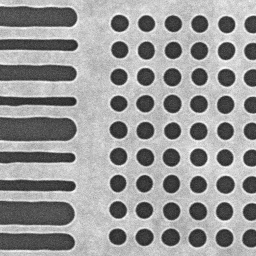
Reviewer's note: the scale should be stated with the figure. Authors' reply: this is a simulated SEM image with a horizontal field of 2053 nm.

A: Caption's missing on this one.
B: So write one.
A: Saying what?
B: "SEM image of groups of lines, slits or small figures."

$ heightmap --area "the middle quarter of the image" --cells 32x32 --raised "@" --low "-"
--@@@@@@@@@@@@@@@@@@@@@@@@@@@@@@
---@@@@@@@@@---@@@@---@@@@---@@@
---@@@@@@@@@----@@-----@@----@@@
---@@@@@@@@-----@@-----@@-----@@
@@@@@@@@@@@@----@@----@@@----@@@
@@@@@@@@@@@@@-@@@@@@-@@@@@--@@@@
@@@@@@@@@@@@@@@@@@@@@@@@@@@@@@@@
@@@@@@@@@@@@@@@@@@@@@@@@@@@@@@@@
---@@@@@@@@@---@@@@---@@@----@@@
---@@@@@@@@-----@@-----@@----@@-
--@@@@@@@@@-----@@-----@@-----@-
@@@@@@@@@@@@---@@@@---@@@----@@@
@@@@@@@@@@@@@@@@@@@@@@@@@@@-@@@@
-@@@@@@@@@@@@@@@@@@@@@@@@@@@@@@@
---@@@@@@@@@@--@@@@@-@@@@@@-@@@@
---@@@@@@@@-----@@----@@@----@@@
---@@@@@@@@-----@@-----@@----@@-
---@@@@@@@@@----@@-----@@----@@-
--@@@@@@@@@@@--@@@@---@@@@--@@@@
-@@@@@@@@@@@@@@@@@@@@@@@@@@@@@@@
@@@@@@@@@@@@@@@@@@@@@@@@@@@@@@@@
@@@@@@@@@@@@---@@@@---@@@---@@@@
---@@@@@@@@-----@@----@@@----@@-
---@@@@@@@@-----@@-----@@----@@-
--@@@@@@@@@@---@@@----@@@----@@@
@@@@@@@@@@@@@@@@@@@@-@@@@@--@@@@
@@@@@@@@@@@@@@@@@@@@@@@@@@@@@@@@
@@@@@@@@@@@@@@@@@@@@@@@@@@@@@@@@
@@@@@@@@@@@@---@@@----@@@----@@@
--@@@@@@@@@-----@@----@@@----@@-
---@@@@@@@@-----@@----@@@----@@-
---@@@@@@@@@---@@@----@@@---@@@@